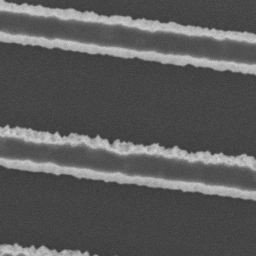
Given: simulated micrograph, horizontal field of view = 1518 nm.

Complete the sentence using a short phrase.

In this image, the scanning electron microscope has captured one or a few lines or trenches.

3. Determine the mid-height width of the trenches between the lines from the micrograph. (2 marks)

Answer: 539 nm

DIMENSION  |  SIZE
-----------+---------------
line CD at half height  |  191 nanometres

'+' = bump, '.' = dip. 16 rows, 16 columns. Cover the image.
++..............
+++++++++.......
.+++++++++++++++
.........+++++++
................
................
................
................
+++.............
+++++++++++.....
..++++++++++++++
..........++++++
................
................
................
................